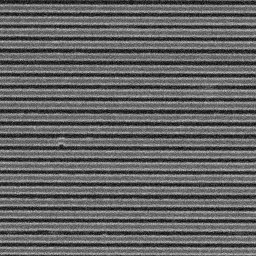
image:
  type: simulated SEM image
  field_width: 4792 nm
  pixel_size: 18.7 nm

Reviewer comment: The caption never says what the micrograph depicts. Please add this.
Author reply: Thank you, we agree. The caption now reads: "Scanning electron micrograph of parallel lines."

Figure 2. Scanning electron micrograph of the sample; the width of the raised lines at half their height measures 0.11 micrometres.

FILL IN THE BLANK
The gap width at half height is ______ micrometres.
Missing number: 0.11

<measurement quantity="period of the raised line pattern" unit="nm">227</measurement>